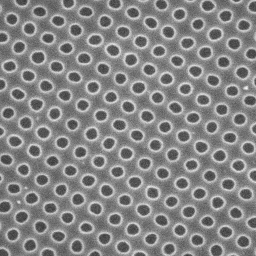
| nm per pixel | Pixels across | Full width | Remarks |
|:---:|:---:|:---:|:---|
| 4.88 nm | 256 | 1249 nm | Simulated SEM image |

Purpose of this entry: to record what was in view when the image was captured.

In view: a regular array of holes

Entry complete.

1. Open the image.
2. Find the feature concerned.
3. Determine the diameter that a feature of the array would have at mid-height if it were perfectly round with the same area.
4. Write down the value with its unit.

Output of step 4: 11.3 pixels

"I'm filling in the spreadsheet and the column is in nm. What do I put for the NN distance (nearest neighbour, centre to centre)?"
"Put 98.8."